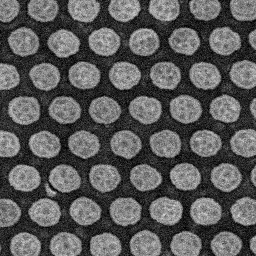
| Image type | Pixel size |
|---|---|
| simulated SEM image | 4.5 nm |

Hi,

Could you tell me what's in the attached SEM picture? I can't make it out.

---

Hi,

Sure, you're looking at a regular array of raised bodies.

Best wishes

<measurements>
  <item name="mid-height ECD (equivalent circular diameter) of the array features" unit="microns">0.122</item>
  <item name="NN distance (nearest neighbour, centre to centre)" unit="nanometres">175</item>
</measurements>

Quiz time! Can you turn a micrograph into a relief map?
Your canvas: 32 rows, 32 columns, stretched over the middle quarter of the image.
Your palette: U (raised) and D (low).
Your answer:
DDDUUUUDDDDDDUUUUDDDDDDUUUUUDDDD
DDUUUUUUDDDDUUUUUUDDDDUUUUUUDDDD
DUUUUUUUUDDDUUUUUUUDDDUUUUUUUDDD
DUUUUUUUDDDDUUUUUUUDDDUUUUUUUDDD
DDUUUUUUDDDDUUUUUUDDDDDUUUUUDDDD
DDDUUUUDDDDDDUUUUDDDDDDDUUUUDDDD
DDDDDDDDDDDDDDDDDDDDDDDDDDDDDDDD
DDDDDDDDDDDDDDDDDDDDDDDDDDDDDDDD
DDDDDDDDDDDDDDDDDDUUUDDDDDDDDUUD
UUUDDDDDUUUUUDDDDUUUUUUDDDDUUUUU
UUUDDDDUUUUUUDDDDUUUUUUUDDDUUUUU
UUUUDDDUUUUUUUDDDUUUUUUUDDDUUUUU
UUUUDDDUUUUUUUDDDUUUUUUUDDDUUUUU
UUUDDDDDUUUUUDDDDDUUUUUDDDDDUUUU
UUDDDDDDDUUUDDDDDDDDDDDDDDDDDDDD
DDDDDDDDDDDDDDDDDDDDDDDDDDDDDDDD
DDDDDDDDDDDDDDDDDDDDDDDDDDDDDDDD
DDDUUUUDDDDDDUUUUDDDDDDUUUUUDDDD
DDUUUUUUDDDDUUUUUUDDDDUUUUUUDDDD
DUUUUUUUDDDDUUUUUUUDDDUUUUUUUDDD
DUUUUUUUDDDDUUUUUUUDDDUUUUUUUDDD
DDUUUUUUDDDDUUUUUUUDDDUUUUUUUDDD
DDDUUUUDDDDDDUUUUUDDDDDUUUUUDDDD
DDDDDDDDDDDDDDDDDDDDDDDDDDDDDDDD
DDDDDDDDDDDDDDDDDDDDDDDDDDDDDDDD
DDDDDDDDDDDDDDDDDDDUDDDDDDDDDUUU
UUDDDDDUUUUUUDDDDUUUUUUDDDDUUUUU
UUUDDDDUUUUUUDDDDUUUUUUUDDDUUUUU
UUUDDDDUUUUUUUDDDUUUUUUUDDDUUUUU
UUUUDDDUUUUUUDDDDUUUUUUUDDDUUUUU
UUUDDDDDUUUUUDDDDDUUUUUDDDDDUUUU
UUDDDDDDDUUDDDDDDDDDUDDDDDDDDDDD